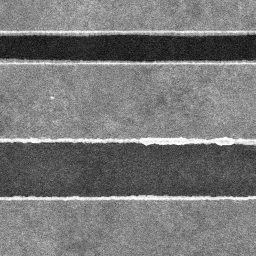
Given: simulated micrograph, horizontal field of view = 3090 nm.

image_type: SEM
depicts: lines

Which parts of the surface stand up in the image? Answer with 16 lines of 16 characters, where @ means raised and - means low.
@@@@@@@@@@@@@@@@
@@@@@@@@@@@@@@@@
----------------
----------------
@@@@@@@@@@@@@@@@
@@@@@@@@@@@@@@@@
@@@@@@@@@@@@@@@@
@@@@@@@@@@@@@@@@
@@@@@@@@@@@@@@@@
----------------
----------------
----------------
@@@@@@@@@@@@@@@@
@@@@@@@@@@@@@@@@
@@@@@@@@@@@@@@@@
@@@@@@@@@@@@@@@@